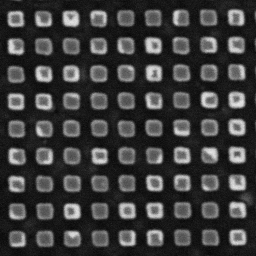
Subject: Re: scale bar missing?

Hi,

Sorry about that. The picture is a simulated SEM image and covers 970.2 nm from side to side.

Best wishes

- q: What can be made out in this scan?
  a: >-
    a regular array of raised bodies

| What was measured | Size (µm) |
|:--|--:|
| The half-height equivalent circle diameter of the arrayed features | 0.0634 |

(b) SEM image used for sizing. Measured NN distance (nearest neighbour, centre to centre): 102 nanometers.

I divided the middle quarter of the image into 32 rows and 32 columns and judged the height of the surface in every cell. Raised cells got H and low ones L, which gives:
LLLLLLLLLLLLLLHHLLLLLHLLLLLLLLLL
HHHHLLLHHHHLLLHHHLLLLHHHLLLLHHHL
HHHHLLLHHHHLLLHHHLLLLHHHLLLLHHHL
HHHHLLLHHHHLLLHHHLLLLHHHLLLLHHHL
LLLLLLLLLLLLLLLLLLLLLLLLLLLLLLLL
LLLLLLLLLLLLLLLLLLLLLLLLLLLLLLLL
LLLLLLLLLLLLLLLLLLLLLLLLLLLLLLLL
HHLLLLLHHLLLLLHLLLLLLLLLLLLLHHHL
HHHHLLLHHHHLLLHHHLLLLHHHLLLLHHHL
HHHHLLLHHHHLLLHHHLLLLHHHLLLLHHHL
HHHHLLLHHHHLLLHHHLLLLHHHLLLLHHHL
LLLLLLLLLLLLLLLLLLLLLLLLLLLLLLLL
LLLLLLLLLLLLLLLLLLLLLLLLLLLLLLLL
LLLLLLLLLLLLLLLLLLLLLLLLLLLLLLLL
HHLLLLLHHHLLLLHHHLLLLHHHLLLLHHHL
HHHHLLLHHHHLLLHHHLLLLHHHLLLLHHHL
HHHHLLLHHHHLLLHHHLLLLHHHLLLLHHHL
HHHHLLLHHHHLLLHHHHLLLHHHLLLLHHHL
LLLLLLLLLLLLLLLLLLLLLLLLLLLLLLLL
LLLLLLLLLLLLLLLLLLLLLLLLLLLLLLLL
LLLLLLLLLLLLLLLLLLLLLLLLLLLLLLLL
HHHLLLLHHHLLLLHHHLLLLHHHLLLLHHHL
HHHHLLLHHHHLLLHHHHLLLHHHLLLLHHHL
HHHHLLLHHHHLLLHHHHLLLHHHLLLLHHHL
LHHHLLLHHHHLLLHHHLLLLHHHLLLLLHHL
LLLLLLLLLLLLLLLLLLLLLLLLLLLLLLLL
LLLLLLLLLLLLLLLLLLLLLLLLLLLLLLLL
LLLLLLLLLLLLLLLLLLLLLLLLLLLLLLLL
HHHHLLLHHHHLLLHHHHLLLHHHLLLLHHHL
HHHHLLLHHHHLLLHHHHLLLHHHLLLLHHHL
HHHHLLLHHHHLLLHHHHLLLHHHLLLLHHHL
LHHLLLLLHHHLLLLHHLLLLHHHLLLLHHHL